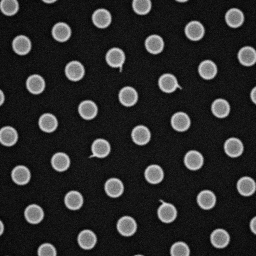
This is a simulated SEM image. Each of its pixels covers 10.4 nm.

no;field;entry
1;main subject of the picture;a regular array of raised bodies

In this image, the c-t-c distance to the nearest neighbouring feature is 0.423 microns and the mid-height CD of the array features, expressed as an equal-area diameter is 186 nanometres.